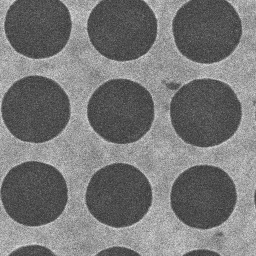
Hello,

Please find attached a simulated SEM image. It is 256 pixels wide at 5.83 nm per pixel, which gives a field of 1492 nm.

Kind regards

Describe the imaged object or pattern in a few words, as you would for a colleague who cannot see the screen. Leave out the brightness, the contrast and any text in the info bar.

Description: holes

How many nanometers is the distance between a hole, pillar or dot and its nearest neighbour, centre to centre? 491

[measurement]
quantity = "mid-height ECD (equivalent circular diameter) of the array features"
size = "0.388 um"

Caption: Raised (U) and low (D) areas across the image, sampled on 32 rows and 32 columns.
UUDDDDDDUUUUDDDDDDUUUUUDDDDDDUUU
UDDDDDDDDUUDDDDDDDDUUUDDDDDDDDUU
UDDDDDDDDUUDDDDDDDDDUUDDDDDDDDUU
UDDDDDDDDUUDDDDDDDDDUUDDDDDDDDUU
UDDDDDDDDUUDDDDDDDDDUUDDDDDDDDUU
UDDDDDDDUUUDDDDDDDDUUUDDDDDDDDUU
UUDDDDDUUUUUDDDDDDUUUUDDDDDDDUUU
UUUUUUUUUUUUUUDDDUUUUUUUDDDDUUUU
UUUUUUUUUUUUUUUUUUUUUUUUUUUUUUUU
UUUUDUUUUUUUUUUUUUUUUUUUUUUUUUUU
UUDDDDDUUUUUUDDDDUUUUUUDDDDDUUUU
UDDDDDDDUUUUDDDDDDDUUUDDDDDDDUUU
DDDDDDDDDUUDDDDDDDDUUDDDDDDDDDUU
DDDDDDDDDUUDDDDDDDDUUDDDDDDDDDUU
DDDDDDDDDUUDDDDDDDDUUDDDDDDDDDUU
UDDDDDDDUUUDDDDDDDDUUDDDDDDDDDUU
UDDDDDDDUUUUDDDDDDUUUUDDDDDDDUUU
UUUDDDUUUUUUUDDDDUUUUUUDDDDDUUUU
UUUUUUUUUUUUUUUUUUUUUUUUUUUUUUUU
UUUUUUUUUUUUUUUUUUUUUUUUUUUUUUUU
UUDDDDUUUUUUUUDDUUUUUUUUUUUUUUUU
UDDDDDDUUUUUDDDDDDUUUUUDDDDDUUUU
DDDDDDDDUUUDDDDDDDDUUUDDDDDDDUUU
DDDDDDDDUUUDDDDDDDDUUDDDDDDDDUUU
DDDDDDDDDUUDDDDDDDDUUDDDDDDDDDUU
DDDDDDDDUUUDDDDDDDDUUDDDDDDDDUUU
UDDDDDDDUUUDDDDDDDUUUUDDDDDDDUUU
UUDDDDDUUUUUDDDDDUUUUUUDDDDDUUUU
UUUUUUUUUUUUUUUUUUUUUUUUDDUUUUUU
UUUUUUUUUUUUUUUUUUUUUUUUUUUUUUUU
UUUUUUUUUUUUUUUUUUUUUUUUUUUUUUUU
UUDDDDDUUUUUUDDDDUUUUUUUDDDUUUUU